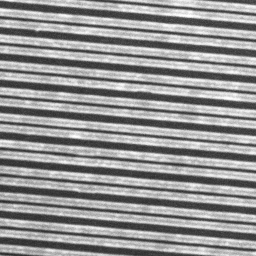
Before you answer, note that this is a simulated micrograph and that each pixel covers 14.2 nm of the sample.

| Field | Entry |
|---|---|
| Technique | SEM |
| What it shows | parallel lines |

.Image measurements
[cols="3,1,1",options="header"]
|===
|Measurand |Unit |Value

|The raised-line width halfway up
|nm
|83.1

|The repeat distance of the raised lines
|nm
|185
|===